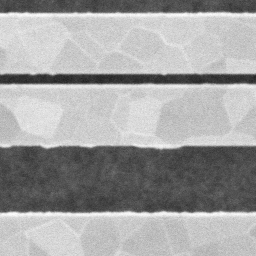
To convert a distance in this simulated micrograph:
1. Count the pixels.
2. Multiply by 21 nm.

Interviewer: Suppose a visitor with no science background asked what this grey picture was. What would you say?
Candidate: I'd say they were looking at lines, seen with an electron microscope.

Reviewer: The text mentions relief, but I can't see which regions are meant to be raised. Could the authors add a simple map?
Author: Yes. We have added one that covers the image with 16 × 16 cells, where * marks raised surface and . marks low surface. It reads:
................
****************
****************
****************
****************
****************
****************
****************
****************
................
................
................
................
****************
****************
****************